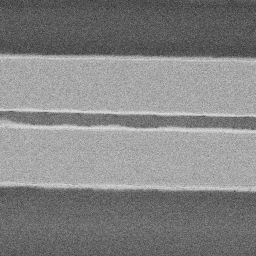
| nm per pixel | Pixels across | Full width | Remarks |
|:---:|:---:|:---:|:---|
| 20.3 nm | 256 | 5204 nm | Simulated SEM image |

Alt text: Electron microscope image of lines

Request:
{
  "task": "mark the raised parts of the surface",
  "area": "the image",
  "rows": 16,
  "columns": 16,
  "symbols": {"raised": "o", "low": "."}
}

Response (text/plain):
................
................
................
................
oooooooooooooooo
oooooooooooooooo
oooooooooooooooo
oooooooooooooooo
oooooooooooooooo
oooooooooooooooo
oooooooooooooooo
.ooooooooooooooo
................
................
................
................